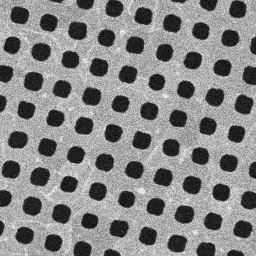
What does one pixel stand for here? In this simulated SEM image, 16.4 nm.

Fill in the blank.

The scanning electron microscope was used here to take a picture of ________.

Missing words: a regular array of holes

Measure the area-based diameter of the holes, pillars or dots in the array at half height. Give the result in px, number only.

18.7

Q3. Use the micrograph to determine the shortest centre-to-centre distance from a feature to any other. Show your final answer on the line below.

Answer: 489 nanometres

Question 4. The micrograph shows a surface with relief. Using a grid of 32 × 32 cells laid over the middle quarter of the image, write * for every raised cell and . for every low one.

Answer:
...***.....****..*************..
******.....***....**************
*******....***....****..********
**************....***....*******
.*************...****....****...
..*******************....***....
..***....*************..****....
.****....*******************....
.***.....****...**************..
*****....***....****************
************....***....*********
************....***.....***..***
*******************....****....*
****..**************...***.....*
***....*******************.....*
***....****...*************...**
***....***.....*****************
****..****.....***...***********
**********....***.....**********
************.****.....***....***
*****************....****....***
*....********************....***
*....****..**************....***
*....***....********************
**..****.....****..*************
********....****....************
*********...***.....***...******
***************.....***....*****
...**************..***.....***..
....******************.....***..
...****...**************..****..
...***.....*******************..